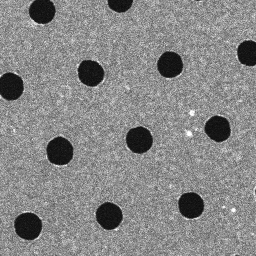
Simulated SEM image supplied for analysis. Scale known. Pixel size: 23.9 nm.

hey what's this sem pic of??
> a regular array of holes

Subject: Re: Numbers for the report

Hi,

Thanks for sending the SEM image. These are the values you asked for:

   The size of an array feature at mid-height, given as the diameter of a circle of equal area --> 649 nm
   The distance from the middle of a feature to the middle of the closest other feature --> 1910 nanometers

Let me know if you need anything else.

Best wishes